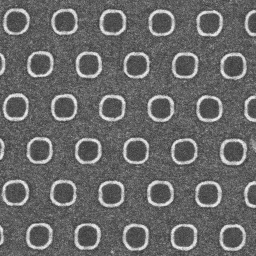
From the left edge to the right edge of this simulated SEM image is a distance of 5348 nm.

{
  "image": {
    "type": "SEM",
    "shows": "a regular array of raised bodies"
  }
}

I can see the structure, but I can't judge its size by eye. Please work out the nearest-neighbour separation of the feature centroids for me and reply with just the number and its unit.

1.01 µm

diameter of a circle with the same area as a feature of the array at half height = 516 nanometers